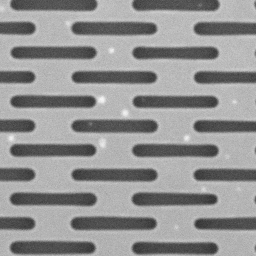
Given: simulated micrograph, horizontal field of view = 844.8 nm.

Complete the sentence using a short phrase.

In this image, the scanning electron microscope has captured groups of lines, slits or small figures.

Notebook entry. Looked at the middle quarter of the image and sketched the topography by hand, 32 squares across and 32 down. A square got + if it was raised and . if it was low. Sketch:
++++++++++++++++++++++++++++++++
++++++++++++++++++++++++++++++++
++.....................+++++++++
++.....................+++++++++
++.....................+++++++++
++++++++++++++++++++++++++++++++
++++++++++++++++++++++++++++++++
++++++++++++++++++++++++++++++++
........+++++++++...............
........+++++++++...............
........+++++++++...............
++++++++++++++++++++++++++++++++
++++++++++++++++++++++++++++++++
++++++++++++++++++++++++++++++++
++.....................+++++++++
++......................++++++++
++.....................+++++++++
++++++++++++++++++++++++++++++++
++++++++++++++++++++++++++++++++
++++++++++++++++++++++++++++++++
........+++++++++...............
........+++++++++...............
........+++++++++...............
+++++++++++++++++++........+++++
++++++++++++++++++++++++++++++++
++++++++++++++++++++++++++++++++
++.....................+++++++++
++.....................+++++++++
++.....................+++++++++
++++++++++++++++++...+++++++++++
++++++++++++++++++++++++++++++++
++++++++++++++++++++++++++++++++